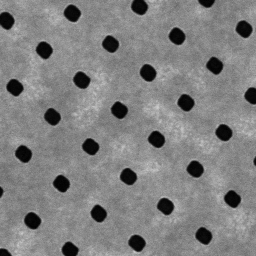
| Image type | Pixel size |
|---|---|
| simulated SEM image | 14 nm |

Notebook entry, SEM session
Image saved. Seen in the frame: a regular array of holes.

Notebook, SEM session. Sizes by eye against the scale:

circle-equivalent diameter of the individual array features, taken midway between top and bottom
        237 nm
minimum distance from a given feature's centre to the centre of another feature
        0.651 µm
